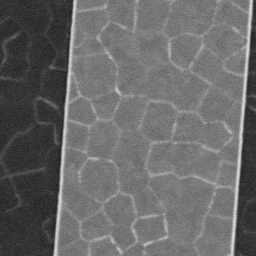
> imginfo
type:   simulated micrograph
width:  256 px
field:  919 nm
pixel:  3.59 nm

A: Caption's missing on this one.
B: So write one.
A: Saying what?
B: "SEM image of one or a few lines or trenches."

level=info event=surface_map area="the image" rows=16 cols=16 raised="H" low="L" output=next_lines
LLLLLHHHHHHHHHHH
LLLLLHHHHHHHHHHH
LLLLHHHHHHHHHHHH
LLLLHHHHHHHHHHHL
LLLLHHHHHHHHHHHL
LLLLHHHHHHHHHHHL
LLLLHHHHHHHHHHHL
LLLLHHHHHHHHHHHL
LLLLHHHHHHHHHHHL
LLLLHHHHHHHHHHHL
LLLLHHHHHHHHHHHL
LLLLHHHHHHHHHHHL
LLLLHHHHHHHHHHHL
LLLLHHHHHHHHHHHL
LLLLHHHHHHHHHHHL
LLLHHHHHHHHHHHHL